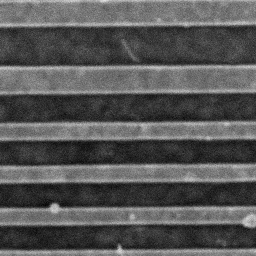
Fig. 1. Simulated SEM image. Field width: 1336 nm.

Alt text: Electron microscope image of groups of lines, slits or small figures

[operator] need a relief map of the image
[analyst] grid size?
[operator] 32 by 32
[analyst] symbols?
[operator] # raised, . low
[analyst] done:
################################
################################
################################
................................
................................
................................
................................
................................
##..############################
################################
################################
################................
................................
................................
................................
..........######################
################################
................................
................................
................................
................................
################################
##############################..
................................
................................
................................
################################
################################
................................
................................
................................
.........#######################